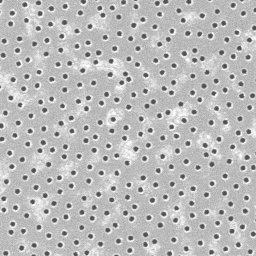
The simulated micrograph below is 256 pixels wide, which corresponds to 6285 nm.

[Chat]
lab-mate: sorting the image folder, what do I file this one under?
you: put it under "a regular array of holes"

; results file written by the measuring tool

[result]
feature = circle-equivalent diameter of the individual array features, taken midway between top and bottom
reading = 5.41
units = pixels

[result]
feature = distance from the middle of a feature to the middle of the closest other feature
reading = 0.301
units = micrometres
